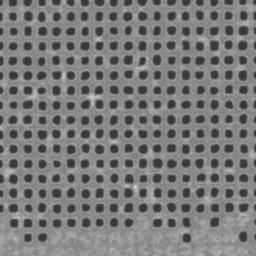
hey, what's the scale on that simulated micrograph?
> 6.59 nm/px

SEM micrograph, a regular array of holes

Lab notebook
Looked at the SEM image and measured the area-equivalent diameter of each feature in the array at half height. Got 9.38 px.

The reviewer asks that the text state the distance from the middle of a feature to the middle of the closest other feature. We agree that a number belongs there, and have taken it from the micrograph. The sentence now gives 0.0921 µm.